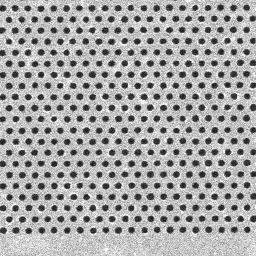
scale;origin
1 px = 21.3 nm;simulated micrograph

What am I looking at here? a regular array of holes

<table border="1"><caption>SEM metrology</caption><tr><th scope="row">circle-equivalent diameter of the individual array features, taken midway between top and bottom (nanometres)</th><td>148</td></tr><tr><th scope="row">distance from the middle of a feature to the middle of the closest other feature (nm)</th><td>264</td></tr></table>